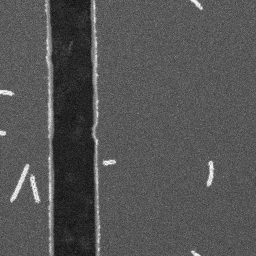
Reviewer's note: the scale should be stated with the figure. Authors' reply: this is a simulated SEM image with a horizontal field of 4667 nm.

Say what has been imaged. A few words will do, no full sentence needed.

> one or a few lines or trenches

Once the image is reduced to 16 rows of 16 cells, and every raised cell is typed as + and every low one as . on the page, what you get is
+++...++++++++++
+++...++++++++++
+++...++++++++++
+++...++++++++++
+++...++++++++++
+++...++++++++++
+++...++++++++++
+++...++++++++++
+++...++++++++++
+++...++++++++++
+++...++++++++++
+++...++++++++++
+++...++++++++++
+++...++++++++++
+++...++++++++++
+++...++++++++++